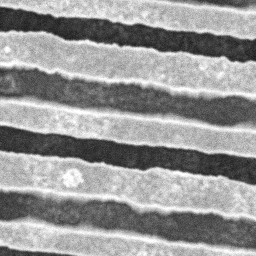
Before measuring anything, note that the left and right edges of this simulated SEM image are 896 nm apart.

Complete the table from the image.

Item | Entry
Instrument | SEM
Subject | lines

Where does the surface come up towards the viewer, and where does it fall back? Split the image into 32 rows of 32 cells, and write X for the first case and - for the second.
XXXXXXXXXXXXXXXXXXXXXXXX--------
----XXXXXXXXXXXXXXXXXXXXXXXXXXXX
--------------XXXXXXXXXXXXXXXXXX
--------------------XXXXXXXXXXXX
XXXXXXX----------------------XXX
XXXXXXXXXXXXX-------------------
XXXXXXXXXXXXXXXXXXXX------------
XXXXXXXXXXXXXXXXXXXXXXXXXXXXX---
-----XXXXXXXXXXXXXXXXXXXXXXXXXXX
----------XXXXXXXXXXXXXXXXXXXXXX
--------------------XXXXXXXXXXXX
------------------------X-XXXXXX
--------------------------------
XXXXXXX-------------------------
XXXXXXXXXXXXXXXX----------------
XXXXXXXXXXXXXXXXXXXXXXXXX-------
-----XXXXXXXXXXXXXXXXXXXXXXXXXXX
--------------XXXXXXXXXXXXXXXXXX
----------------------XXXXXXXXXX
XXXXX-------------------------XX
XXXXXXXXXXXXX-------------------
XXXXXXXXXXXXXXXXXXXXXX----------
XXXXXXXXXXXXXXXXXXXXXXXXXXXXX---
XXXXXXXXXXXXXXXXXXXXXXXXXXXXXXXX
----------XXXXXXXXXXXXXXXXXXXXXX
-----------------XXXXXXXXXXXXXXX
---------------------------XXXXX
--------------------------------
XXXXXXX-------------------------
XXXXXXXXXXXXXXXX----------------
XXXXXXXXXXXXXXXXXXXXX-----------
------XXXXXXXXXXXXXXXXXXXXXXXXX-